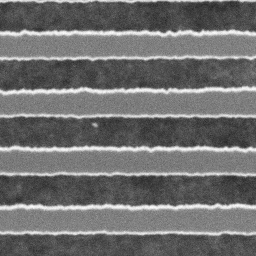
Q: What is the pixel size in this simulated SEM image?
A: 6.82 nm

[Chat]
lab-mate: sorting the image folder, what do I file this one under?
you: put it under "lines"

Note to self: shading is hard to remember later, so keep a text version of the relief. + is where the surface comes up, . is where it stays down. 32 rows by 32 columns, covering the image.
................................
................................
................................
................................
++++++++++++++++++++++++++++++++
++++++++++++++++++++++++++++++++
++++++++++++++++++++++++++++++++
................................
................................
................................
................................
++++++++++++++++++++++++++++++++
++++++++++++++++++++++++++++++++
++++++++++++++++++++++++++++++++
++.+...+++++.+.+++++++++++++++++
................................
................................
................................
.+........++.............+......
++++++++++++++++++++++++++++++++
++++++++++++++++++++++++++++++++
++++++++++++++++++++++++++++++++
................................
................................
................................
................................
++++++++++++++++++++++++++++++++
++++++++++++++++++++++++++++++++
++++++++++++++++++++++++++++++++
................................
................................
................................